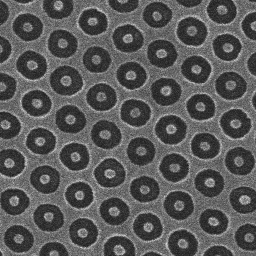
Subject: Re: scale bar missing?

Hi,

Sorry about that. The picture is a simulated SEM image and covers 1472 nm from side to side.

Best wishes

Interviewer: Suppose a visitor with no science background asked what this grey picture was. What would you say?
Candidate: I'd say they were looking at a regular array of ring-shaped grooves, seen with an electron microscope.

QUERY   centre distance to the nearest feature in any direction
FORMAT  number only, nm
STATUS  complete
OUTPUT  214